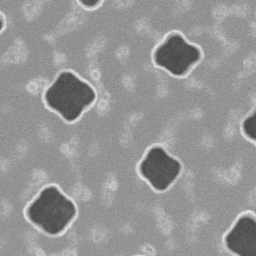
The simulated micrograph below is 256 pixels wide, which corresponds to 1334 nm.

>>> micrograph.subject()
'holes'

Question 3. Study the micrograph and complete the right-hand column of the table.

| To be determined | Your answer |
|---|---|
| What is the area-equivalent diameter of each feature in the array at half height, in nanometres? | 218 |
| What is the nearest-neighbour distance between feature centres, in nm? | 598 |